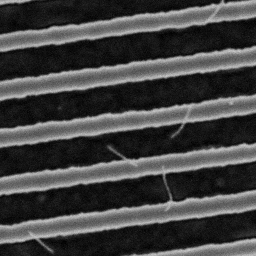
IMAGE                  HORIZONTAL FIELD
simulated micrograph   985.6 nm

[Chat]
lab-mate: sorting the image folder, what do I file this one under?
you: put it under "lines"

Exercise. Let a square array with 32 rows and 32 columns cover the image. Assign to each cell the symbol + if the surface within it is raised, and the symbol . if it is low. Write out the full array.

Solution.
+..........................+++++
.....................+++++++++++
.............++++++++++++++++...
......+++++++++++++++...........
++++++++++++++..................
++++++++........................
...........................+++++
....................++++++++++++
............+++++++++++++++++...
.....+++++++++++++++++..........
++++++++++++++..................
+++++++.........................
...........................+++++
.....................+++++++++++
............+++++++++++++++++...
....++++++++++++++++++..........
++++++++++++++..................
+++++++.........................
............................++++
....................++++++++++++
............++++++++++++++++++..
....+++++++++++++++++...........
+++++++++++++++.................
+++++++.........................
...........................+++++
....................++++++++++++
.............++++++++++++++++++.
....++++++++++++++++++..........
+++++++++++++++.................
+++++++.........................
............................++++
....................++++++++++++